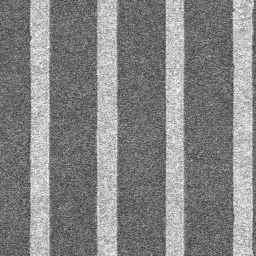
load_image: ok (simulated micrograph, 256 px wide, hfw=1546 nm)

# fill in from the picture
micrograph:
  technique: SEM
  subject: one or a few lines or trenches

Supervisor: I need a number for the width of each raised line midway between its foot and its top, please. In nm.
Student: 111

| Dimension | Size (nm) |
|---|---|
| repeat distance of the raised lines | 409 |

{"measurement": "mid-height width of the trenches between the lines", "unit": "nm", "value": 300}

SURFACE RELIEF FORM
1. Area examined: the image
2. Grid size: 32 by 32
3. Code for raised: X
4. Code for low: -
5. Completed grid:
----XX------XX-------XX------XXX
----XX------XX-------XX------XX-
----XX------XX-------XX------XX-
----XX------XX-------XX------XX-
----XX------XX-------XX------XX-
----XX------XX-------XX------XX-
----XX------XX-------XX------XX-
----XX------XX-------XX------XX-
----XX------XX-------XX------XX-
----XX------XX-------XX------XX-
----XX------XX-------XX------XX-
----XX------XX-------XX------XX-
----XX------XX-------XX------XX-
----XX------XX-------XX------XX-
----XX------XX-------XX------XX-
----XX------XX-------XX------XX-
----XX------XX-------XX------XX-
----XX------XX-------XX------XX-
----XX------XX-------XX------XX-
----XX------XXX------XX------XX-
----XX------XXX------XX------XX-
----XX------XXX------XX------XX-
----XX------XXX------XX------XX-
----XX------XXX------XX------XX-
----XX------XXX------XX------XX-
----XX------XXX------XX------XX-
----XX------XXX------XX------XX-
----XX------XXX------XX------XX-
----XX------XXX------XX------XX-
----XX------XXX------XX------XX-
----XX------XXX------XX------XX-
----XX------XXX------XX------XXX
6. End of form